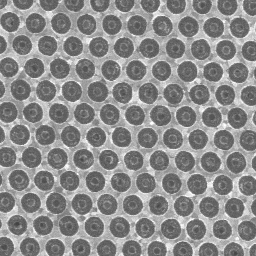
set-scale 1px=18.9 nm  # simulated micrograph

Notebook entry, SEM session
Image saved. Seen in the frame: a regular array of ring-shaped grooves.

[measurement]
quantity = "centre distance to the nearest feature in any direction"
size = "477 nm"